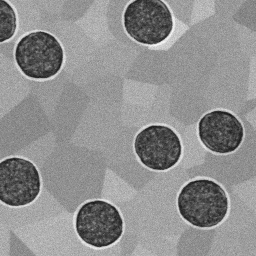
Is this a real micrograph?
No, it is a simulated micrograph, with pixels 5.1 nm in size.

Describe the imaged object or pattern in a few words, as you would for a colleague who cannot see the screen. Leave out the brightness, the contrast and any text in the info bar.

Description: holes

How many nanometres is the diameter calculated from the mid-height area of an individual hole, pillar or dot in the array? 246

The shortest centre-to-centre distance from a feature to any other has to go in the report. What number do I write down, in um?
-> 0.365